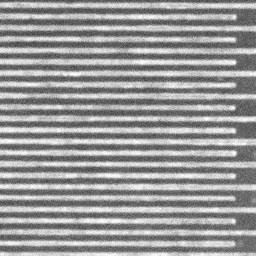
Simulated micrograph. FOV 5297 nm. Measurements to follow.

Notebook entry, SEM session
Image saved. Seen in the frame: parallel lines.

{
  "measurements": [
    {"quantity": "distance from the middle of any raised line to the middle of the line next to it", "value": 235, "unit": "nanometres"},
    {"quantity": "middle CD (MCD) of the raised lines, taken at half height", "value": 0.0543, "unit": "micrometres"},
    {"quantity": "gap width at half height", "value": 178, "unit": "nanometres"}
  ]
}